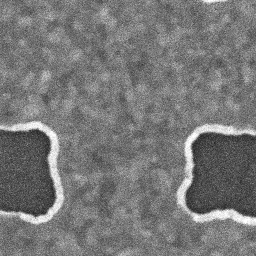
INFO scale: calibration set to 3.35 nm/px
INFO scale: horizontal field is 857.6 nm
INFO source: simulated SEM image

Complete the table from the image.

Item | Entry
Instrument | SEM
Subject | holes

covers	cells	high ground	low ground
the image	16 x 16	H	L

HHHHHHHHHHHHHHHH
HHHHHHHHHHHHHHHH
HHHHHHHHHHHHHHHH
HHHHHHHHHHHHHHHH
HHHHHHHHHHHHHHHH
HHHHHHHHHHHHHHHH
HHHHHHHHHHHHHHHH
HHHHHHHHHHHHHHHH
LLLHHHHHHHHHLLLL
LLLHHHHHHHHHLLLL
LLLHHHHHHHHHLLLL
LLLHHHHHHHHHLLLL
LLLHHHHHHHHHLLLL
HHLHHHHHHHHHHHHL
HHHHHHHHHHHHHHHH
HHHHHHHHHHHHHHHH